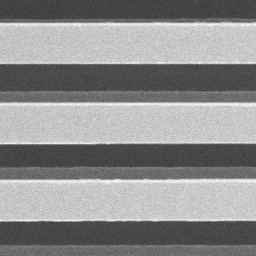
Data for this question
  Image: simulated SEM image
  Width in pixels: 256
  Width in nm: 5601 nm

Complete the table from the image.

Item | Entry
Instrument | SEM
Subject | lines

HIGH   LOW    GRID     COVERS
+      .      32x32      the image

................................
................................
......................++..+++++.
++++++++++++++++++++++++++++++++
++++++++++++++++++++++++++++++++
++++++++++++++++++++++++++++++++
++++++++++++++++++++++++++++++++
++++++++++++++++++++++++++++++++
................................
................................
................................
................................
++++++++++++++++++++++++++++++++
++++++++++++++++++++++++++++++++
++++++++++++++++++++++++++++++++
++++++++++++++++++++++++++++++++
++++++++++++++++++++++++++++++++
++++++++++++++++++++++++++++++++
................................
................................
................................
++++++++++++++++++++++++++++++++
++++++++++++++++++++++++++++++++
++++++++++++++++++++++++++++++++
++++++++++++++++++++++++++++++++
++++++++++++++++++++++++++++++++
++++++++++++++++++++++++++++++++
++++++++++++++++++++++++++++++++
................................
................................
................................
++++++++++++++++++++++++++++++++